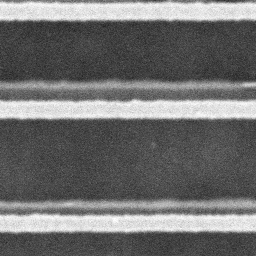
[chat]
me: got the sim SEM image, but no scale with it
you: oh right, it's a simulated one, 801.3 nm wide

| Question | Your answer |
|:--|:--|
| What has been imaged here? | lines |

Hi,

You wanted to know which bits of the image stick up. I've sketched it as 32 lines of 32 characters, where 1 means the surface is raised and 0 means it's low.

11111111111111111111111111111111
11111111111111111111111111111111
01001010111000100000000011100000
00000000000000000000000000000000
00000000000000000000000000000000
00000000000000000000000000000000
00000000000000000000000000000000
00000000000000000000000000000000
00000000000000000000000000000000
00000000000000000000000000000000
00000000000000000000000000000011
11111111111111111111111111111111
11111111111111111111111111111111
11111111111111111111111111111111
11111111111111111111111111111111
00000000000000000000000000000000
00000000000000000000000000000000
00000000000000000000000000000000
00000000000000000000000000000000
00000000000000000000000000000000
00000000000000000000000000000000
00000000000000000000000000000000
00000000000000000000000000000000
00000000000000000000000000000000
00000000000000000000000000000000
00000000100000000000000000000000
11111111111111111111111111111111
11111111111111111111111111111111
11111111111111111111111111111111
00000000000000000000000000000000
00000000000000000000000000000000
00000000000000000000000000000000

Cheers